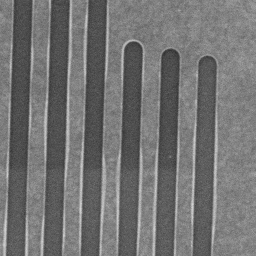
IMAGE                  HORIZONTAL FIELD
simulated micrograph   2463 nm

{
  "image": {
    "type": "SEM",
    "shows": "groups of lines, slits or small figures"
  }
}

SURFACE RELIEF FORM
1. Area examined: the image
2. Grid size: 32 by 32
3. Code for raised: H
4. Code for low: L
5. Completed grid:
HHLLHHLLLHHLLHHHHHHHHHHHHHHHHHHH
HHLLHHLLLHHLLHHHHHHHHHHHHHHHHHHH
HHLLHHLLLHHLLLHHHHHHHHHHHHHHHHHH
HHLLHHLLLHHLLHHHHHHHHHHHHHHHHHHH
HHLLHHLLLHHLLHHHHHHHHHHHHHHHHHHH
HLLLHHLLLHHLLHHHLLHHHHHHHHHHHHHH
HLLLHHLLLHHLLHHLLLHHLLHHHHHHHHHH
HLLLHHLLLHHLLHHLLLHHLLLHHLLHHHHH
HLLLHHLLLHHLLHHLLLHHLLLHHLLHHHHH
HLLLHHLLLHHLLHHLLLHHLLHHHLLHHHHH
HLLLHHLLLHHLLHHLLLHHLLHHHLLHHHHH
HLLLHHLLLHHLLHHLLLHHLLHHHLLHHHHH
HLLLHHLLLHHLLHHLLLHHLLHHHLLHHHHH
HLLLHHLLLHHLLHHLLLHHLLHHHLLHHHHH
HLLLHHLLLHHLLHHLLLHHLLHHHLLHHHHH
HLLLHHLLLHLLLHHLLLHHLLHHLLLHHHHH
HLLLHHLLLHLLLHHLLLHHLLHHLLLHHHHH
HLLLHHLLHHLLLHHLLLHHLLHHLLLHHHHH
HLLLHHLLHHLLLHHLLLHHLLHHLLLHHHHH
HLLLHHLLHHLLLHHLLLHHLLHHLLLHHHHH
HLLLHHLLHHLLLHHLLLHHLLHHLLLHHHHH
HLLHHHLLHHLLLHHLLLHHLLHHLLLHHHHH
HLLHHHLLHHLLLHHLLLHLLLHHLLLHHHHH
HLLHHHLLHHLLLHHLLLHLLLHHLLLHHHHH
HLLHHHLLHHLLLHHLLLHLLLHHLLLHHHHH
HLLHHHLLHHLLLHHLLLHLLLHHLLLHHHHH
HLLHHLLLHHLLLHHLLHHLLLHHLLLHHHHH
HLLHHLLLHHLLLHHLLHHLLLHHLLLHHHHH
HLLHHLLLHHLLLHHLLHHLLLHHLLLHHHHH
HLLHHLLLHHLLLHHLLHHLLLHHLLLHHHHH
HLLHHLLLHHLLLHHLLHHLLLHHLLLHHHHH
HLLHHLLLHHLLLHHLLHHLLLHHLLHHHHHH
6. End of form